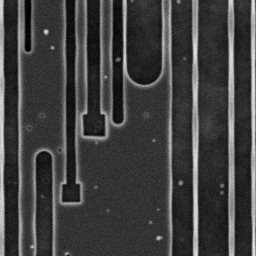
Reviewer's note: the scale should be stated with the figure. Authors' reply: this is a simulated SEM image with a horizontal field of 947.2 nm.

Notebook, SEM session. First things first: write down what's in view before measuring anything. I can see groups of lines, slits or small figures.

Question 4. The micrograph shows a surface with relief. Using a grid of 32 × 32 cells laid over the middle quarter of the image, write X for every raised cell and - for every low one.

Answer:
---XXX---XXX-------------XX-----
---XXX---XXX---X---------XX-----
---XXX---XXX---X--------XXX-----
---XXX---XXX---X--------XXX-----
---XXX---XXX---XX-----XXXXX-----
---XXX---XXX---XXXXXXXXXXXX-----
---XXX---XXX---XXXXXXXXXXXX-----
---XXX---XXX---XXXXXXXXXXXX-----
---XXX---XXX---XXXXXXXXXXXX-----
---XXX---XXX---XXXXXXXXXXXX-----
---XXX---XXX---XXXXXXXXXXXX-----
---XXX---XXX---XXXXXXXXXXXX-----
---XX-----XX---XXXXXXXXXXXX-----
---X------XX---XXXXXXXXXXXX-----
---X-------X---XXXXXXXXXXXX-----
---X-------XXXXXXXXXXXXXXXX-----
---XX------XXXXXXXXXXXXXXXX-----
---XX------XXXXXXXXXXXXXXXX-----
---XXXXXXXXXXXXXXXXXXXXXXXX-----
---XXXXXXXXXXXXXXXXXXXXXXXX-----
---XXXXXXXXXXXXXXXXXXXXXXXX-----
---XXXXXXXXXXXXXXXXXXXXXXXX-----
---XXXXXXXXXXXXXXXXXXXXXXXX-----
---XXXXXXXXXXXXXXXXXXXXXXXX-----
---XXXXXXXXXXXXXXXXXXXXXXXX-----
---XXXXXXXXXXXXXXXXXXXXXXXX-----
---XXXXXXXXXXXXXXXXXXXXXXXX-----
---XXXXXXXXXXXXXXXXXXXXXXXX-----
---XXXXXXXXXXXXXXXXXXXXXXXX-----
---XXXXXXXXXXXXXXXXXXXXXXXX-----
----XXXXXXXXXXXXXXXXXXXXXXX-----
----XXXXXXXXXXXXXXXXXXXXXXX-----